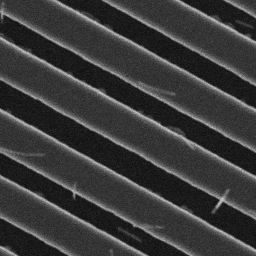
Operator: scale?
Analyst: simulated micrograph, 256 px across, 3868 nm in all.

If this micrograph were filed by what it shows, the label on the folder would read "lines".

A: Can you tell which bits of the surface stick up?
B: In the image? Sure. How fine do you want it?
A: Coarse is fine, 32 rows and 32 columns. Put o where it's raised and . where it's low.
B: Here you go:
oooooooo......ooooooooo......ooo
oooooooooo.....oooooooooo......o
..ooooooooo......oooooooooo.....
....ooooooooo......oooooooooo...
.....oooooooooo......oooooooooo.
oo.....oooooooooo......ooooooooo
ooo......oooooooooo......ooooooo
ooooo......oooooooooo.....oooooo
ooooooo......oooooooooo.....oooo
ooooooooo......ooooooooo......oo
.oooooooooo.....oooooooooo......
...oooooooooo.....oooooooooo....
.....ooooooooo......oooooooooo..
.......ooooooooo......oooooooooo
oo......oooooooooo......oooooooo
ooo.......oooooooooo......oooooo
ooooo.......oooooooooo.....ooooo
ooooooo.......oooooooooo.....ooo
ooooooooo.......ooooooooo......o
.oooooooooo.......ooooooooo.....
...oooooooooo......oooooooooo...
.....ooooooooo.......oooooooooo.
o.....oooooooooo.......ooooooooo
ooo.....oooooooooo.......ooooooo
ooooo.....oooooooooo.......ooooo
ooooooo.....oooooooooo......oooo
oooooooo......ooooooooo.......oo
.ooooooooo......ooooooooo.......
..oooooooooo.....oooooooooo.....
....oooooooooo.....oooooooooo...
......oooooooooo.....oooooooooo.
o.......oooooooooo.....ooooooooo